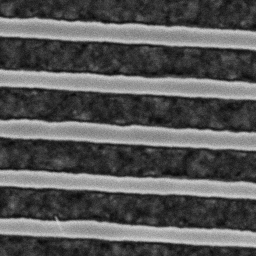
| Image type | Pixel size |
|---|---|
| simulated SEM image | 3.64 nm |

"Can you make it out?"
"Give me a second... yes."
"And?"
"lines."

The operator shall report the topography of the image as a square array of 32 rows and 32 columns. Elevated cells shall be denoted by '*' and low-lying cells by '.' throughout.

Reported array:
................................
................................
*******.........................
************************........
********************************
..................**************
................................
................................
................................
****************................
********************************
............********************
................................
................................
................................
*************...................
*****************************...
.........***********************
..........................******
................................
................................
******..........................
**************************......
....*..*************************
.........................*******
................................
................................
*****...........................
***********************.........
....****************************
.......................*********
................................